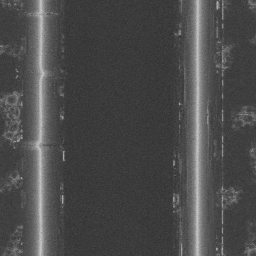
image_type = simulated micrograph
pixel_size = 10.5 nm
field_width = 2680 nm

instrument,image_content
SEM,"one or a few lines or trenches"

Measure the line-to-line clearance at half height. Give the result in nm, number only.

1640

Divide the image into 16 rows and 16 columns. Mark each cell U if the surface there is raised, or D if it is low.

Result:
UUUDDDDDDDDDUUUU
UUUDDDDDDDDDUUUU
UUUDDDDDDDDDUUUU
UUUDDDDDDDDDUUUU
UUUDDDDDDDDDUUUU
UUUDDDDDDDDDUUUU
UUUDDDDDDDDDUUUU
UUUDDDDDDDDDUUUU
UUUDDDDDDDDDUUUU
UUDDDDDDDDDDUUUU
UUUDDDDDDDDDUUUU
UUUDDDDDDDDDUUUU
UUUDDDDDDDDDUUUU
UUUDDDDDDDDDUUUU
UUUDDDDDDDDDUUUU
UUUDDDDDDDDDUUUU